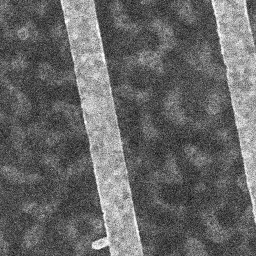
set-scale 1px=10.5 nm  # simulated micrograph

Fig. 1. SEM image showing one or a few lines or trenches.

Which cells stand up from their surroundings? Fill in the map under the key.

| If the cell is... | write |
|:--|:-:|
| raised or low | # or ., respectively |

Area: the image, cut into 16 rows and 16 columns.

....##.......##.
....##........##
....##........##
.....##.......##
.....##.......##
.....##.......##
.....##........#
.....##........#
......#........#
......##.......#
......##.......#
......##.......#
......##........
......##........
.......##.......
.......##.......